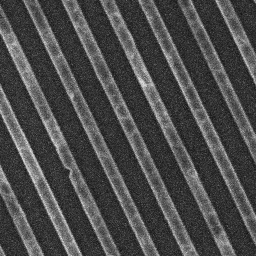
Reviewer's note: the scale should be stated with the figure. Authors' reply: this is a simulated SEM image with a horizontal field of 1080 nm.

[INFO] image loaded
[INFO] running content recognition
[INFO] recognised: parallel lines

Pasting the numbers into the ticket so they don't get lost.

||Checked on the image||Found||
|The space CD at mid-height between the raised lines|96.2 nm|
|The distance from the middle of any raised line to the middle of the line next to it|0.147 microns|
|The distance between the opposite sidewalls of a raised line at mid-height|51.9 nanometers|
